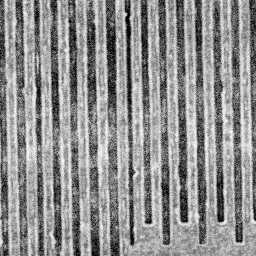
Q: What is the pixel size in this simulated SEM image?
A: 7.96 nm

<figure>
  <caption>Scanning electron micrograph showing parallel lines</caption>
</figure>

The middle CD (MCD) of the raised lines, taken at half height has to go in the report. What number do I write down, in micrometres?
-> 0.0727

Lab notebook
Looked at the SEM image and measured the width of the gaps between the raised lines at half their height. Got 9.13 pixels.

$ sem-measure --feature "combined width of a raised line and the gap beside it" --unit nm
144